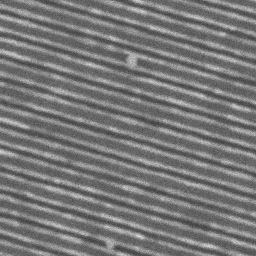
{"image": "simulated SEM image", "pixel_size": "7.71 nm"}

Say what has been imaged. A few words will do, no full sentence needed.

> parallel lines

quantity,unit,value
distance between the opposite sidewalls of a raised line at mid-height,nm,32.4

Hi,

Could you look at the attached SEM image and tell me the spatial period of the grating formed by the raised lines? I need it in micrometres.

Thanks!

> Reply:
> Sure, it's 0.0834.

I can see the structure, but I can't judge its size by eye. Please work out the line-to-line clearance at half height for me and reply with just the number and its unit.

51.9 nm